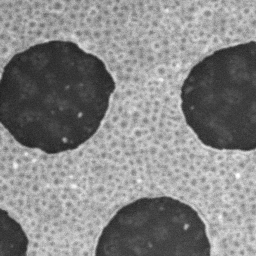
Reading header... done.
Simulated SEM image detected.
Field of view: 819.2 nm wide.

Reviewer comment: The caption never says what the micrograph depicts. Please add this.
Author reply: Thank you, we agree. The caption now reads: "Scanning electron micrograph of holes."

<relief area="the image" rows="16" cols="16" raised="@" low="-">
@@@@@@@@@@@@@@@@
@@@@@@@@@@@@@@@@
@@@@@@@@@@@@@@@@
@-----@@@@@@@---
-------@@@@@----
-------@@@@-----
-------@@@@-----
------@@@@@@----
@-----@@@@@@----
@@@-@@@@@@@@@@@@
@@@@@@@@@@@@@@@@
@@@@@@@@@@@@@@@@
@@@@@@@@@--@@@@@
-@@@@@@------@@@
--@@@@-------@@@
--@@@@-------@@@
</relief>